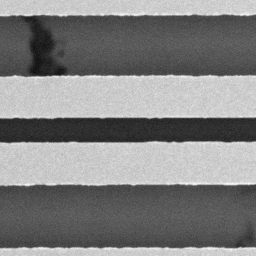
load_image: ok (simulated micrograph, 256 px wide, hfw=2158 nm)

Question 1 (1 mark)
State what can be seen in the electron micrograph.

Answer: lines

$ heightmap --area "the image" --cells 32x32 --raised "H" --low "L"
HHHHHHHHHHHHHHHHHHHHHHHHHHHHHHHH
HHHHHHHHHHHHHHHHHHHHHHHHHHHHHHHH
LLLLLLLLLLLLLLLLLLLLLLLLLLLLLLLL
LLLLLLLLLLLLLLLLLLLLLLLLLLLLLLLL
LLLLLLLLLLLLLLLLLLLLLLLLLLLLLLLL
LLLLLLLLLLLLLLLLLLLLLLLLLLLLLLLL
LLLLLLLLLLLLLLLLLLLLLLLLLLLLLLLL
LLLLLLLLLLLLLLLLLLLLLLLLLLLLLLLL
LLLLLLLLLLLLLLLLLLLLLLLLLLLLLLLL
LLLLLLLLLLLLLLLLLLLLLLLLLLLLLLLL
HHHHHHHHHHHHHHHHHHHHHHHHHHHHHHHH
HHHHHHHHHHHHHHHHHHHHHHHHHHHHHHHH
HHHHHHHHHHHHHHHHHHHHHHHHHHHHHHHH
HHHHHHHHHHHHHHHHHHHHHHHHHHHHHHHH
HHHHHHHHHHHHHHHHHHHHHHHHHHHHHHHH
LLLLLLLLLLLLLLLLLLLLLLLLLLLLLLLL
LLLLLLLLLLLLLLLLLLLLLLLLLLLLLLLL
LLLLLLLLLLLLLLLLLLLLLLLLLLLLLLLL
HHHHHHHHHHHHHHHHHHHHHHHHHHHHHHHH
HHHHHHHHHHHHHHHHHHHHHHHHHHHHHHHH
HHHHHHHHHHHHHHHHHHHHHHHHHHHHHHHH
HHHHHHHHHHHHHHHHHHHHHHHHHHHHHHHH
HHHHHHHHHHHHHHHHHHHHHHHHHHHHHHHH
LLLLLLLLLLLLLLLLLLLLLLLLLLLLLLLL
LLLLLLLLLLLLLLLLLLLLLLLLLLLLLLLL
LLLLLLLLLLLLLLLLLLLLLLLLLLLLLLLL
LLLLLLLLLLLLLLLLLLLLLLLLLLLLLLLL
LLLLLLLLLLLLLLLLLLLLLLLLLLLLLLLL
LLLLLLLLLLLLLLLLLLLLLLLLLLLLLLLL
LLLLLLLLLLLLLLLLLLLLLLLLLLLLLLLL
LLLLLLLLLLLLLLLLLLLLLLLLLLLLLLLL
HHHHHHHHHHHHHHHHHHHHHHHHHHHHHHHH